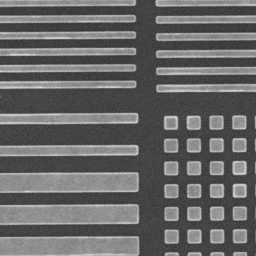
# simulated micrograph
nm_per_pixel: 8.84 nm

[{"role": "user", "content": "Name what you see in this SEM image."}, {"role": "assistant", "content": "groups of lines, slits or small figures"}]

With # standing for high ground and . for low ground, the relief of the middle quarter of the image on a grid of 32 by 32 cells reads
##################..............
##################.....#########
.......................####.....
................................
##################..............
##################.....#########
.......................#########
................................
................................
................................
................................
................................
..............####..............
##################.......###...#
##################.......###...#
.........................###...#
................................
................................
................................
.........................###...#
##################.......###...#
##################.......###...#
##################..............
................................
................................
.........................###...#
.........................###...#
##################.......###...#
##################..............
##################..............
##################.......###...#
##################.......###...#